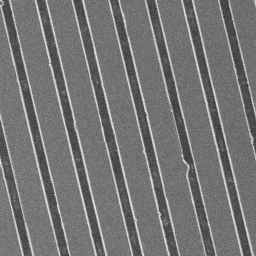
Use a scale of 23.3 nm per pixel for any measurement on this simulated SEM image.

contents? parallel lines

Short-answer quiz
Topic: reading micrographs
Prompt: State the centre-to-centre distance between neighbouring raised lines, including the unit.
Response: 831 nm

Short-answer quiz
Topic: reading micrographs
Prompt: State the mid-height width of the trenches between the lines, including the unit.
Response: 227 nm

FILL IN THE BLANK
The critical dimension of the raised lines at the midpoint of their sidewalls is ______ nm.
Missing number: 611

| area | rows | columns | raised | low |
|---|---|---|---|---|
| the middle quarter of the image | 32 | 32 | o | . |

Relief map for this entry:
oooooo...oooooo...oooooo...ooooo
oooooo...oooooo...oooooo...ooooo
oooooo...ooooooo..ooooooo..ooooo
ooooooo..ooooooo...oooooo..ooooo
ooooooo...oooooo...oooooo...oooo
.oooooo...oooooo...oooooo...oooo
.oooooo...ooooooo..ooooooo..oooo
.ooooooo..ooooooo..ooooooo..oooo
.ooooooo..ooooooo...oooooo...ooo
.ooooooo...oooooo...oooooo...ooo
..oooooo...ooooooo..ooooooo..ooo
..ooooooo..ooooooo..ooooooo..ooo
..ooooooo..ooooooo...oooooo...oo
..ooooooo...oooooo...ooooooo..oo
...oooooo...ooooooo..ooooooo..oo
...ooooooo..ooooooo..ooooooo..oo
o..ooooooo..ooooooo...oooooo...o
o..ooooooo...oooooo...oooooo...o
o...oooooo...oooooo...ooooooo..o
o...oooooo...ooooooo..ooooooo..o
oo..ooooooo..ooooooo...oooooo..o
oo..ooooooo...oooooo...oooooo...
oo...oooooo...oooooo...ooooooo..
oo...oooooo...ooooooo..ooooooo..
oo...ooooooo..ooooooo..ooooooo..
ooo..ooooooo..ooooooo...ooooooo.
ooo...oooooo...oooooo...ooooooo.
ooo...oooooo...ooooooo..ooooooo.
ooo...ooooooo..ooooooo..ooooooo.
oooo..ooooooo..ooooooo...oooooo.
oooo..ooooooo...oooooo...oooooo.
oooo...oooooo...oooooo...ooooooo